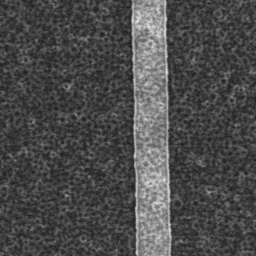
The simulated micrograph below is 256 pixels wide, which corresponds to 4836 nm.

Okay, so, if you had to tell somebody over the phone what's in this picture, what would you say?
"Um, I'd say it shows one or a few lines or trenches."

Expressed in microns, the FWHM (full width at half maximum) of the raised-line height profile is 0.635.